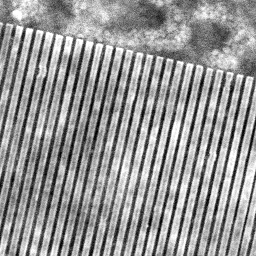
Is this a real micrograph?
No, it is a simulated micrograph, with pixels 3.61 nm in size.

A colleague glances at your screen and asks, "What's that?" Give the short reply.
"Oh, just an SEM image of parallel lines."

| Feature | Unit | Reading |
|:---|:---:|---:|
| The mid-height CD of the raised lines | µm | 0.0216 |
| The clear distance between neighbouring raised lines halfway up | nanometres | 15.9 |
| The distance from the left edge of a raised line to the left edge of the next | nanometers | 37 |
